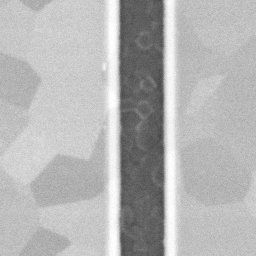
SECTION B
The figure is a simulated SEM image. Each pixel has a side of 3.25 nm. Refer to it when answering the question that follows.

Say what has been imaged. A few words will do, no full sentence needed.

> one or a few lines or trenches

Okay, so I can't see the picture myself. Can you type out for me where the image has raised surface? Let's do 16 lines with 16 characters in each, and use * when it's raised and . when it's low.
*******....*****
*******....*****
*******....*****
*******....*****
*******....*****
*******....*****
*******....*****
*******....*****
*******....*****
*******....*****
*******....*****
*******....*****
*******....*****
*******....*****
*******....*****
*******....*****